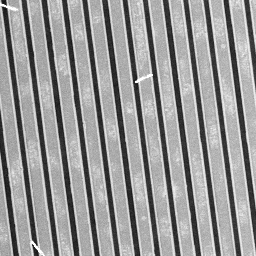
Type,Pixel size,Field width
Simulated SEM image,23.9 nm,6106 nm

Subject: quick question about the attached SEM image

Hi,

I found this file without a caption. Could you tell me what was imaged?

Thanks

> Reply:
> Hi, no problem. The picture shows parallel lines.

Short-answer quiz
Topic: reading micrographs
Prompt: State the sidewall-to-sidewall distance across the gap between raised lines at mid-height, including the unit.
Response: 172 nanometers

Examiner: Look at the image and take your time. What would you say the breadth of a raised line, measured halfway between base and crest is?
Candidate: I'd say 12.6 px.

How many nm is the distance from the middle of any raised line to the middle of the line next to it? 478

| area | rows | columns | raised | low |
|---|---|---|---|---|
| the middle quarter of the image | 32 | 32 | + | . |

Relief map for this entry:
+..+++..+++..+++..++++.++++.+++.
+..+++..+++..+++..++++..+++..+++
+..++++..+++..+++..+++..+++..+++
++..+++..+++..+++..+++..+++..+++
++..+++..+++..+++..+++..+++..+++
++..+++..+++..+++..+++..+++..+++
++..+++..+++..+++..+++..+++..+++
++..+++..+++..+++..+++..+++..+++
++..+++..+++..+++..++++..+++..++
++..++++.++++.+++..++++..+++..++
++..++++..+++..+++..+++..+++..++
+++..+++..+++..+++..+++..+++..++
+++..+++..+++..+++..+++..+++..++
+++..+++..+++..+++..+++..+++..++
+++..+++..+++..+++..+++..+++..++
+++..+++..+++..+++..+++..+++..++
+++..+++..+++..+++..++++..+++..+
+++..++++..+++.++++.++++..+++..+
+++..++++..+++..+++..+++..+++..+
.+++..+++..+++..+++..+++..+++..+
.+++..+++..+++..+++..+++..+++..+
.+++..+++..+++..+++..+++..+++..+
.+++..+++..+++..+++..+++..+++..+
.+++..+++..+++..+++..+++..+++..+
.+++..+++..+++..+++..++++..+++..
.+++..++++..+++..+++.++++..+++..
.+++..++++..+++..+++..+++..+++..
..+++..+++..+++..+++..+++..+++..
..+++..+++..+++..+++..+++..+++..
..+++..+++..+++..+++..+++..+++..
..+++..+++..+++..+++..+++..+++..
..+++..+++..+++..+++..++++.+++..